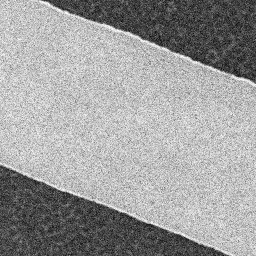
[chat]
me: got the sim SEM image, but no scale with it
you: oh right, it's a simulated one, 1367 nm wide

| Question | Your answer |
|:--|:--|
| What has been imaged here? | one or a few lines or trenches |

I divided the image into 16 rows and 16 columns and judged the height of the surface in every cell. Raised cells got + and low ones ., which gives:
+++.............
++++++..........
+++++++++.......
+++++++++++.....
++++++++++++++..
++++++++++++++++
++++++++++++++++
++++++++++++++++
++++++++++++++++
++++++++++++++++
.+++++++++++++++
...+++++++++++++
......++++++++++
........++++++++
...........+++++
.............+++